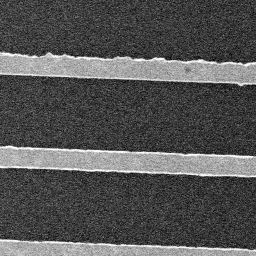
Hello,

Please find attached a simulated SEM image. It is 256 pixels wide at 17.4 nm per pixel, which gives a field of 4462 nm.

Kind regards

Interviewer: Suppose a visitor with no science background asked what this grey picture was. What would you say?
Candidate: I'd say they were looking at one or a few lines or trenches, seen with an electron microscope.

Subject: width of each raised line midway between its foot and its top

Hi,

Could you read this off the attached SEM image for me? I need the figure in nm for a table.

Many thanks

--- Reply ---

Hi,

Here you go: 348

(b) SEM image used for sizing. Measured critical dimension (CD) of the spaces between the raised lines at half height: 73 px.